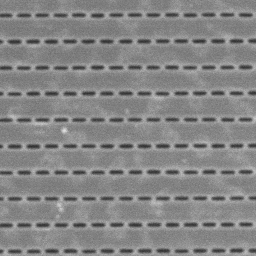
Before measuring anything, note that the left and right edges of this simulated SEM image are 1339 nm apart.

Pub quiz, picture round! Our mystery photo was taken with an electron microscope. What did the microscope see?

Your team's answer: a regular array of holes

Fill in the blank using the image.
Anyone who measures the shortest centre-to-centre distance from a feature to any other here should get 95.6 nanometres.